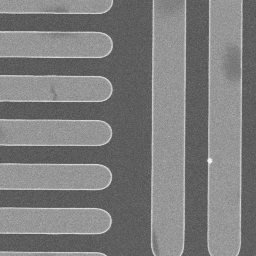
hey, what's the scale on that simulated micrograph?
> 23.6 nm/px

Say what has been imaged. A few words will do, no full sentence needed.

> groups of lines, slits or small figures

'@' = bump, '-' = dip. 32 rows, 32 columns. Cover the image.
@@@@@@@@@@@@@@-----@@@@---@@@@--
@@@@@@@@@@@@@------@@@@---@@@@--
-------------------@@@@---@@@@--
-------------------@@@@---@@@@--
@@@@@@@@@@@@@@-----@@@@---@@@@--
@@@@@@@@@@@@@@-----@@@@---@@@@--
@@@@@@@@@@@@@@-----@@@@---@@@@--
-------------------@@@@---@@@@--
-------------------@@@@---@@@@--
@@@@@@@@-----------@@@@---@@@@--
@@@@@@@@@@@@@@-----@@@@---@@@@--
@@@@@@@@@@@@@@-----@@@@---@@@@--
@@@@@@@@@@@@@------@@@@---@@@@--
-------------------@@@@---@@@@--
-------------------@@@@---@@@@--
@@@@@@@@@@@@@------@@@@---@@@@--
@@@@@@@@@@@@@@-----@@@@---@@@@--
@@@@@@@@@@@@@@-----@@@@---@@@@--
-------------------@@@@---@@@@--
-------------------@@@@---@@@@--
@@-----------------@@@@---@@@@--
@@@@@@@@@@@@@@-----@@@@---@@@@--
@@@@@@@@@@@@@@-----@@@@---@@@@--
@@@@@@@@@@@@@------@@@@---@@@@--
-------------------@@@@---@@@@--
-------------------@@@@---@@@@--
@@@@@@@@@@@@@------@@@@---@@@@--
@@@@@@@@@@@@@@-----@@@@---@@@@--
@@@@@@@@@@@@@@-----@@@@---@@@@--
-------------------@@@@---@@@@--
-------------------@@@@---@@@@--
-------------------@@@@---@@@@--